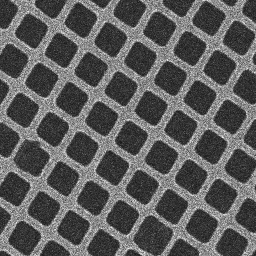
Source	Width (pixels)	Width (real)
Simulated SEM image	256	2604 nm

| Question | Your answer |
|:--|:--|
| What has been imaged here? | a regular array of holes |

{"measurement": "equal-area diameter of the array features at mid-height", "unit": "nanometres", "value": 314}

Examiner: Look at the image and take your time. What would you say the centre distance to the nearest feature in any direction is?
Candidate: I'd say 0.36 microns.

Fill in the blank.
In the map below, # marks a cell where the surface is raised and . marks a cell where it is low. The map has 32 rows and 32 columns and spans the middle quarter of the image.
.##........#####......###...####
###........######.....##......##
###.......###..###...##........#
####......##.....######........#
#####....##.......####........##
...####.###........####......###
.....#####........#######....##.
......####........##...###..###.
......#####......##.....######..
......##.####...###.......####..
.....##....###.###........#####.
....###.....######........##.###
#...##.......#####.......##...##
#####........######......##.....
.####........##..###....##......
.#####.......##....###.##.......
.######.....##......#####.......
.##..####..###.......#####......
##.....######........######.....
##......#####.......###..###...#
#........#####......##....######
........#######....###......####
#.......##...###..###........###
##.....###....######........####
###....##.......####........##..
.####.##........#####......##...
...#####........##.####....##...
....####.......##....###..##....
....######.....##.....######....
...###..###...##.......#####....
...##....#######........#####...
..##......#####........###.###..